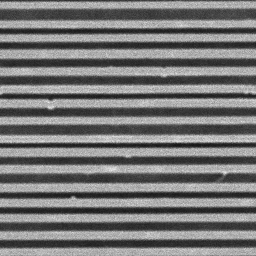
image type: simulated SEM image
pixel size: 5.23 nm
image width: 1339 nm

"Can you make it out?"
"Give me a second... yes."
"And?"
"parallel lines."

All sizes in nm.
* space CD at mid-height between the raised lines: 44.1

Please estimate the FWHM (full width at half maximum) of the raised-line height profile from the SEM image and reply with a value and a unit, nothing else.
0.0444 microns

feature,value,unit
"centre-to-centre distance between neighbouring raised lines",86.1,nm